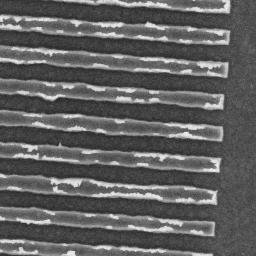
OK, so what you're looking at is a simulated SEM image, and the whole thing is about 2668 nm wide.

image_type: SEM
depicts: parallel lines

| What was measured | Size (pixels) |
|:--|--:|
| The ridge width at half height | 14.1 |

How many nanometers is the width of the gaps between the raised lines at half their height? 191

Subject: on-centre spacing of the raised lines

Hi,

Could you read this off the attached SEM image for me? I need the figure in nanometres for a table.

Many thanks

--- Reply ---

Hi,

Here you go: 332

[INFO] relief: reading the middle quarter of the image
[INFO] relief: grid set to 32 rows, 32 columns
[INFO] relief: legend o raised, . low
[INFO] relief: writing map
..o..ooooooooooooooooooooooooooo
................oooooooooooooooo
................................
................................
................................
ooooooo.........................
oooooooooooooooooooo............
oooooooooooooooooooooooooooooooo
...ooooooooooooooooooooooooooooo
.................o.oooo.oooooooo
...............................o
................................
................................
oooooooo........................
oooooooooooooooooooo............
oooooooooooooooooooooooooooooooo
ooo.oooooooooooooooooooooooooooo
............o.oooooooooooooooooo
................................
................................
................................
oooooo..........................
oooooooooooooooooooo.oo.........
oooooooooooooooooooooooooooooooo
..oooooooooooooooooooooooooooooo
................oooooooooooooooo
..............................oo
................................
................................
oooooooooo......................
oooooooooooooooooo.....o........
oooooooooooooooooooooooooooooooo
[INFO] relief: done